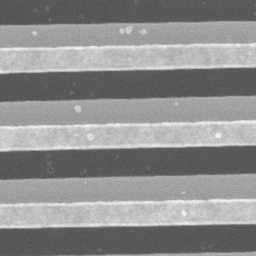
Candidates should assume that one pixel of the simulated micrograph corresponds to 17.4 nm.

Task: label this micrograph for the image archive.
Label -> lines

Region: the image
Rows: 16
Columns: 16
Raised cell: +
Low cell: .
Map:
................
......++++++++++
++++++++++++++++
++++++++++++++++
+++.............
................
++++++++++++++++
++++++++++++++++
++++++++++++++++
................
................
++++++++++++++++
++++++++++++++++
++++++++++++++++
................
................